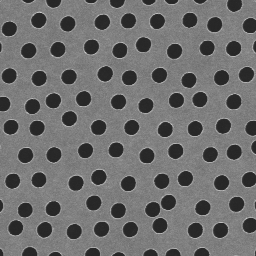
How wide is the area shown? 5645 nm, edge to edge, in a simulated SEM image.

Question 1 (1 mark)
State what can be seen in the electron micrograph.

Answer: a regular array of holes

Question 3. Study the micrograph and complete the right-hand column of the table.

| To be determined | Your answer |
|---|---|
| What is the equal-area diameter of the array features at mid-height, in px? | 15.2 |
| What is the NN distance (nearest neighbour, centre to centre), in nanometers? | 555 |